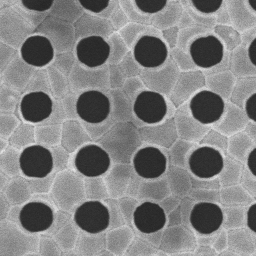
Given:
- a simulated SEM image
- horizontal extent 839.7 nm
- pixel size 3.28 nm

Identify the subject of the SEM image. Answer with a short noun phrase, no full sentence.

a regular array of holes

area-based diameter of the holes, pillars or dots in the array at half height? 104 nm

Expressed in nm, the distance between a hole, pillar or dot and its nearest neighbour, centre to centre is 181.